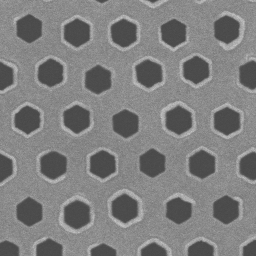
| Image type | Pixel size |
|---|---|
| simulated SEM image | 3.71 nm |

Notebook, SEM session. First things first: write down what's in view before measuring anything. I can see a regular array of holes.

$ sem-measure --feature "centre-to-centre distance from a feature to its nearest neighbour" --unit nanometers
177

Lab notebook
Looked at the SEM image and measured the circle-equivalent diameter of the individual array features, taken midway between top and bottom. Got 0.0967 micrometres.